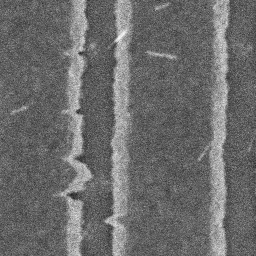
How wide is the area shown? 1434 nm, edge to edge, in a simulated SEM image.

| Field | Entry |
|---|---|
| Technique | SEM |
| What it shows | one or a few lines or trenches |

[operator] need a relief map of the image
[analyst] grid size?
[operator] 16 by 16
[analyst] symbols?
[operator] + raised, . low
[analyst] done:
+++++...++++++..
+++++...++++++..
+++++...++++++..
+++++...++++++..
+++++...++++++..
+++++...++++++..
+++++...++++++..
+++++...++++++..
+++++..+++++++..
+++++..+++++++..
+++++..+++++++..
+++++..+++++++..
++++...+++++++..
+++++..+++++++..
+++++..+++++++..
+++++..+++++++..